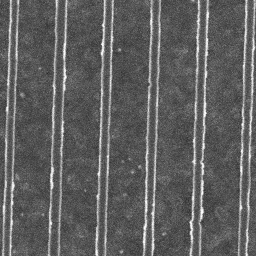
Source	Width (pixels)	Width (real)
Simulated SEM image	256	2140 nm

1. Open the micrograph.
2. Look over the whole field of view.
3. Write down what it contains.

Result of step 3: parallel lines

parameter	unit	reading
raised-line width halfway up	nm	83.6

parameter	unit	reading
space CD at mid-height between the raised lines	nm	312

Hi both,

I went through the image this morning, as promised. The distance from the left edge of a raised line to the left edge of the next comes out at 395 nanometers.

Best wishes